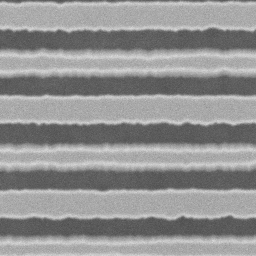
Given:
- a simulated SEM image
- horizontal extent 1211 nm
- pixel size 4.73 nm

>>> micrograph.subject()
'lines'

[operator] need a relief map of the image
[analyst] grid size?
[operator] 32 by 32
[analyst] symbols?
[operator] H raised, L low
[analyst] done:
HHHHHHHHHHHHHHHHHHHHHHHHHHHHHHHH
HHHHHHHHHHHHHHHHHHHHHHHHHHHHHHHH
HHHHHHHHHHHHHHHHHHHHHHHHHHHHHHHH
HHHHHHHHHHHHHHHHHHHHHHHHHHLHHHHH
LLLLLLLLLLLLLLLLLLLLLLLLLLLLLLLL
LLLLLLLLLLLLLLLLLLLLLLLLLLLLLLLL
HHLLLHLLLLLLLLLLLLLLLLLLHHHLLHLL
HHHHHHHHHHHHHHHHHHHHHHHHHHHHHHHH
HHHHHHHHHHHHHHHHHHHHHHHHHHHHHHHH
LLLLLLLLLLLLLLLLLLLLLLLLLLLLLLLL
LLLLLLLLLLLLLLLLLLLLLLLLLLLLLLLL
LLLLLLLLLLLLLLLLLLLLLLLLLLLLLLLL
HHHHHHHHHHHHHHHHHHHHHHHHHHHHHHHH
HHHHHHHHHHHHHHHHHHHHHHHHHHHHHHHH
HHHHHHHHHHHHHHHHHHHHHHHHHHHHHHHH
LLLLLHLHHHHHLHHLHLHLLHHLHHHLLHLL
LLLLLLLLLLLLLLLLLLLLLLLLLLLLLLLL
LLLLLLLLLLLLLLLLLLLLLLLLLLLLLLLL
HHHHHHHHHHHHHHHHHHHHHHHHHHHHHHHH
HHHHHHHHHHHHHHHHHHHHHHHHHHHHHHHH
HHHHHHHHHHHHHHHHHHHHHHHHHHHHHHHH
LLLLLLLLLLLLLLLLLLLLLLLLLLLLLLLL
LLLLLLLLLLLLLLLLLLLLLLLLLLLLLLLL
LLLLLLLLLLLLLLLLLLLLLLLLLLLLLLLL
HHHHHHHHHHHHHHHHHHHHHHHHHHHHHHHH
HHHHHHHHHHHHHHHHHHHHHHHHHHHHHHHH
HHHHHHHHHHHHHHHHHHHHHHHHHHHHHHHH
LLLLLLLLLLLLLLLLLLLLLLLLLLLLLLLL
LLLLLLLLLLLLLLLLLLLLLLLLLLLLLLLL
LLLLLLLLLLLLLLLLLLLLLLLLLLLLLLLL
HHHHHHHHHHHHHHHHHHHHHHHHHHHHHHHH
HHHHHHHHHHHHHHHHHHHHHHHHHHHHHHHH